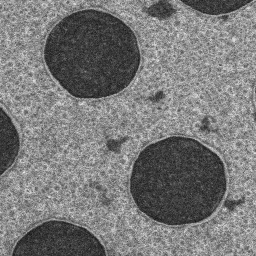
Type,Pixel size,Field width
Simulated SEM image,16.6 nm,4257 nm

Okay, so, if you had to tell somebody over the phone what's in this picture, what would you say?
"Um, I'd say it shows holes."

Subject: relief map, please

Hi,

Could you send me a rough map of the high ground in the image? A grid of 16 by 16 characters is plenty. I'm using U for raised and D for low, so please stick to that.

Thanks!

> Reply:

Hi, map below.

UUUUUUUUUUUUDDDU
UUUUDDDDUUUUUUUU
UUUDDDDDDUUUUUUU
UUUDDDDDDUUUUUUU
UUUDDDDDDUUUUUUU
UUUUDDDDUUUUUUUU
UUUUUUUUUUUUUUUU
DUUUUUUUUUUUUUUU
DUUUUUUUUUUUUUUU
DUUUUUUUUDDDDUUU
DUUUUUUUDDDDDDUU
UUUUUUUUDDDDDDUU
UUUUUUUUDDDDDDUU
UUUUUUUUUDDDDUUU
UUDDDDUUUUUUUUUU
UDDDDDUUUUUUUUUU